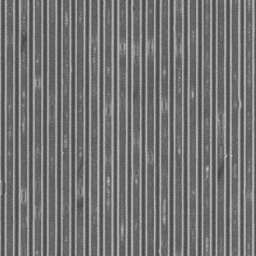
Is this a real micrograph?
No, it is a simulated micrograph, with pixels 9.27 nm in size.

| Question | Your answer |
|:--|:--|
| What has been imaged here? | parallel lines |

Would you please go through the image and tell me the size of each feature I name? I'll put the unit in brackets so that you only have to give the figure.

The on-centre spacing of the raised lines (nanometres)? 130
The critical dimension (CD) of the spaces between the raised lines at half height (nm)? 73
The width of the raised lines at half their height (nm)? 56.8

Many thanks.